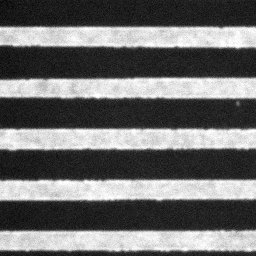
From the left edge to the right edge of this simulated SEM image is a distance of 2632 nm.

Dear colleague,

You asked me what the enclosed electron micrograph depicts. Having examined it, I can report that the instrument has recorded lines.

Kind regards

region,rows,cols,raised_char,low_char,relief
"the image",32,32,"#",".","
................................
................................
................................
................................
################################
################################
................................
................................
................................
................................
################################
################################
................................
................................
................................
................................
################################
################################
##################.###.#......#.
................................
................................
................................
................................
################################
################################
................................
................................
................................
................................
################################
################################
................................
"